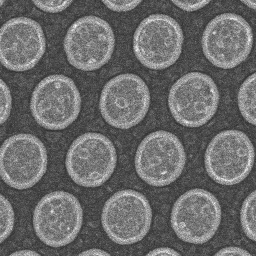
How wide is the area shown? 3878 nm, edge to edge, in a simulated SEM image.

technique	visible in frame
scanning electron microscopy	a regular array of raised bodies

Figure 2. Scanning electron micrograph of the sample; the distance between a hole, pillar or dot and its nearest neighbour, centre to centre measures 1020 nm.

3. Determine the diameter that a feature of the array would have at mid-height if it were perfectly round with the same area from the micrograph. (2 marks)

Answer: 727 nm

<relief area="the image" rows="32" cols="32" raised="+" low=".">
.....+++......+++.....+++......+
................................
..........++......+++......+++..
+++++....+++++...+++++....+++++.
+++++....+++++...++++++...+++++.
+++++...++++++...++++++...+++++.
+++++...++++++...+++++....+++++.
+++++....++++.....++++.....+++..
..+.............................
........................+.......
.....++++.....++++....+++++....+
+...++++++...+++++....+++++...++
+...++++++...+++++...++++++...++
+...++++++...+++++...++++++...++
+...+++++....+++++....++++.....+
.....+++......+++...............
................................
.+++......+++.....++++.....++++.
+++++....+++++....+++++...+++++.
++++++...+++++...++++++...+++++.
++++++..++++++...++++++...+++++.
+++++....+++++...+++++....+++++.
.++++.....+++.....+++......+++..
................................
......+++.....+++......+++.....+
+....+++++....++++....+++++....+
+....+++++...++++++...+++++...++
+...++++++...++++++...+++++...++
+....+++++...+++++....+++++....+
+....++++.....++++.....+++.....+
......+.........................
...........+.......++.......++..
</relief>